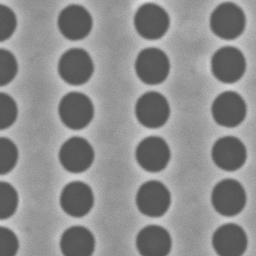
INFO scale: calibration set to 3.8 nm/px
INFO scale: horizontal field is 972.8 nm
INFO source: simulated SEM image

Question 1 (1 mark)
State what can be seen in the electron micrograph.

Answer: a regular array of holes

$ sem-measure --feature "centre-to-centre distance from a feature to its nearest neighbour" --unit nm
167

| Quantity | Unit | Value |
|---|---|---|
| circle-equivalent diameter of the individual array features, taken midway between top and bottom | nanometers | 137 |